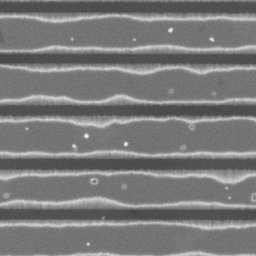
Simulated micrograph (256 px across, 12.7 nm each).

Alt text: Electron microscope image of lines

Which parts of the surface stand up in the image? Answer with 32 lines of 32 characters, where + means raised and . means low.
................................
................................
++++++++++++++++++++++++++++++++
++++++++++++++++++++++++++++++++
++++++++++++++++++++++++++++++++
++++++++++++++++++++++++++++++++
................................
................................
+++++++++++++++++.++++++++++++++
++++++++++++++++++++++++++++++++
++++++++++++++++++++++++++++++++
++++++++++++++++++++++++++++++++
++++++++++++++++++++++++++++++++
................................
................................
++++++++++++++++++++++++++++++++
++++++++++++++++++++++++++++++++
++++++++++++++++++++++++++++++++
++++++++++++++++++++++++++++++++
.+++.+++++++....+++++++++.+++++.
................................
..........+++.+++++.............
++++++++++++++++++++++++++++++++
++++++++++++++++++++++++++++++++
++++++++++++++++++++++++++++++++
++++++++++....++++++++++++++++++
................................
................................
++++++++++++++++++++++++++++++++
++++++++++++++++++++++++++++++++
++++++++++++++++++++++++++++++++
++++++++++++++++++++++++++++++++